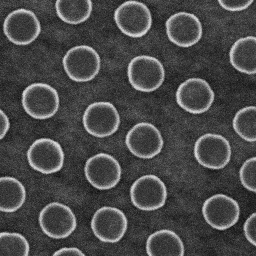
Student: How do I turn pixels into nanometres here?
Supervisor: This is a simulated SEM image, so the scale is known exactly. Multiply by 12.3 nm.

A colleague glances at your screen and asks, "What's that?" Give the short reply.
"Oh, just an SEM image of a regular array of raised bodies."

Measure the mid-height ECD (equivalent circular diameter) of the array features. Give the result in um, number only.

0.43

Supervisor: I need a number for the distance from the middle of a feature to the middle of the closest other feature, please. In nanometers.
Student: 657